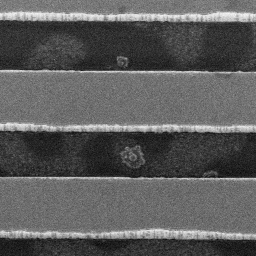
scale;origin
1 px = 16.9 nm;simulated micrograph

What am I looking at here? lines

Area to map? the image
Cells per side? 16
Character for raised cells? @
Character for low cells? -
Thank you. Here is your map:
@@@@@@@@@@@@@@@@
----------------
----------------
----------------
@@@@@@@@@@@@@-@@
@@@@@@@@@@@@@@@@
@@@@@@@@@@@@@@@@
@@@@@@@@@@@@@@@@
----------------
----------------
----------------
@@@@@@@@@@@@@@@@
@@@@@@@@@@@@@@@@
@@@@@@@@@@@@@@@@
@@@@@@@@@@@@@@@@
----------------